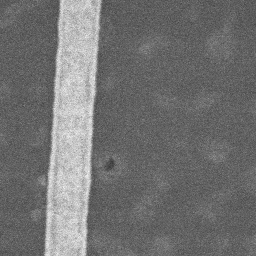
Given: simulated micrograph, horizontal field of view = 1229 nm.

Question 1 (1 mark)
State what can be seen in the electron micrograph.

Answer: one or a few lines or trenches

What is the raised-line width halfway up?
177 nanometers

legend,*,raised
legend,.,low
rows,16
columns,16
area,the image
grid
....**..........
....**..........
....**..........
....**..........
....**..........
....**..........
...***..........
...***..........
...***..........
...***..........
...***..........
...***..........
...**...........
...**...........
...**...........
...**...........